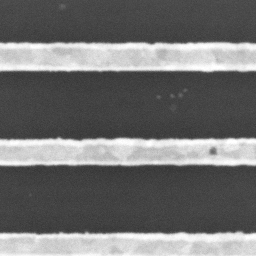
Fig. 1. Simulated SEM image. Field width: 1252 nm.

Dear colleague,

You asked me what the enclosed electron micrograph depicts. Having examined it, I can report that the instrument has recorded lines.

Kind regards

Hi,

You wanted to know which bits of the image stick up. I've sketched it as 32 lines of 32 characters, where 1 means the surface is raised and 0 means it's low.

00000000000000000000000000000000
00000000000000000000000000000000
00000000000000000000000000000000
00000000000000000000000000000000
00000000000000000000000000000000
00000000000000000000000000000000
11111111111111111111111111111111
11111111111111111111111111111111
11111111111111111111111111111111
00000000000000000000000000000000
00000000000000000000000000000000
00000000000000000000000000000000
00000000000000000000000000000000
00000000000000000000000000000000
00000000000000000000000000000000
00000000000000000000000000000000
00000000000000000000000000000000
00000000000000000000000000000000
11111111111111111111111111111111
11111111111111111111111111111111
11110000000000001000000000000000
00000000000000000000000000000000
00000000000000000000000000000000
00000000000000000000000000000000
00000000000000000000000000000000
00000000000000000000000000000000
00000000000000000000000000000000
00000000000000000000000000000000
00000000000000000000000000000000
11111111111111111111111111011111
11111111111111111111111111111111
11111111111111111111111111111111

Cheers